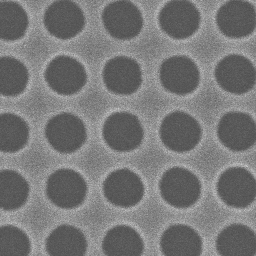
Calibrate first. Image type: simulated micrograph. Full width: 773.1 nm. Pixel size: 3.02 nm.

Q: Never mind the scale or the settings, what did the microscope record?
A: a regular array of holes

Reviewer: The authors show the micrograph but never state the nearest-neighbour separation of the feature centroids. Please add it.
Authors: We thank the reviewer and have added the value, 170 nm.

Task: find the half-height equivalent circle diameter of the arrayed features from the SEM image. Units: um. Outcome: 0.125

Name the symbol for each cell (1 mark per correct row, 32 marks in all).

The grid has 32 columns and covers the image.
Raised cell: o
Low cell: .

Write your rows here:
..oooo...oooo....oooo...oooo....
...ooo....ooo.....oo.....oo.....
....o......oo.....oo.....oo.....
...ooo....ooo.....oo.....oo.....
...oooo...oooo...oooo...oooo...o
oooooooooooooooooooooooooooooooo
oooooooooooooooooooooooooooooooo
..ooooo...oooo...oooo...oooo...o
...ooo.....oo.....oo.....oo.....
....oo.....oo.....oo.....oo.....
...ooo.....oo.....oo.....oo.....
...oooo...oooo...oooo...oooo...o
oooooooooooooooooooooooooooooooo
oooooooooooooooooooooooooooooooo
..ooooo...oooo...oooo...oooo...o
...ooo.....oo.....oo.....oo.....
....oo.....oo.....oo.....oo.....
....oo.....oo.....oo.....oo.....
...oooo...oooo...oooo...oooo...o
oooooooooooooooooooooooooooooooo
oooooooooooooooooooooooooooooooo
..ooooo...oooo...oooo...oooo...o
...ooo.....oo.....oo.....oo.....
....oo.....oo.....oo.....oo.....
....oo.....oo.....oo.....oo.....
...oooo...oooo...oooo...oooo...o
oooooooooooooooooooooooooooooooo
oooooooooooooooooooooooooooooooo
..ooooo...oooo...oooo...oooo...o
...ooo.....oo.....oo.....oo.....
....oo.....oo.....oo.....oo.....
....oo.....oo.....oo.....oo.....